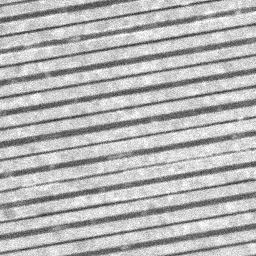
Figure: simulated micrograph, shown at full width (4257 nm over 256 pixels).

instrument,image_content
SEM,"parallel lines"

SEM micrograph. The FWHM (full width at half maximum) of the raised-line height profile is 168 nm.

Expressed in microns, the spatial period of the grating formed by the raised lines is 0.254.